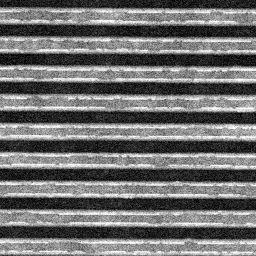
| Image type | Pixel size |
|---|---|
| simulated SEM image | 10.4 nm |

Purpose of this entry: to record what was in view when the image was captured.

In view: parallel lines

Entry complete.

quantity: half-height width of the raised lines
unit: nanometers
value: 153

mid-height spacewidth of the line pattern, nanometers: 145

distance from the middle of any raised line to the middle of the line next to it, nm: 299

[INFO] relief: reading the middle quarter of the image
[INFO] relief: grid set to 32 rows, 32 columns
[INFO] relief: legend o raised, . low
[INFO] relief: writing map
................................
oooooooooooooooooooooooooooooooo
oooooooooooooooooooooooooooooooo
oooooooooooooooooooooooooooooooo
................................
................................
................................
................................
oooooooooooooooooooooooooooooooo
oooooooooooooooooooooooooooooooo
oooooooooooooooooooooooooooooooo
........oooooooooooooooooooooooo
................................
................................
................................
oooooooooooooooooooooooooooooooo
oooooooooooooooooooooooooooooooo
oooooooooooooooooooooooooooooooo
oooooooooooooooooooooooooooooooo
................................
................................
................................
.....oo.........................
oooooooooooooooooooooooooooooooo
oooooooooooooooooooooooooooooooo
oooooooooooooooooooooooooooooooo
................................
................................
................................
............................o...
oooooooooooooooooooooooooooooooo
oooooooooooooooooooooooooooooooo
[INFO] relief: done